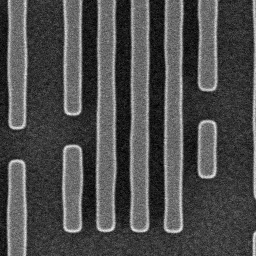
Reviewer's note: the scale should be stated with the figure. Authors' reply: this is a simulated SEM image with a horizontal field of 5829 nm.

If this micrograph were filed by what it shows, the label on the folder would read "groups of lines, slits or small figures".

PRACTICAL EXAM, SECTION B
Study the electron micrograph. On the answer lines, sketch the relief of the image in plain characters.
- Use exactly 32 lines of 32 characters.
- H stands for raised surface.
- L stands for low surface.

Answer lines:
LHHLLLLLHHLLHHLLHHHLLHHLLHHLLLLL
LHHLLLLLHHLLHHLLHHHLLHHLLHHLLLLL
LHHLLLLLHHLLHHLLHHHLLHHLLHHLLLLL
LHHLLLLLHHLLHHLLHHHLLHHLLHHLLLLL
LHHLLLLLHHLLHHLLLHHLLHHLLHHLLLLL
LHHLLLLLHHLLHHLLLHHLLHHLLHHLLLLL
LHHLLLLLHHLLHHLLLHHLLHHLLHHLLLLL
LHHLLLLLHHLLHHLLLHHLLHHLLHHLLLLL
LHHLLLLLHHLLHHLLHHHLLHHLLHHLLLLL
LHHLLLLLHHLLHHLLHHHLLHHLLHHLLLLL
LHHLLLLLHHLLHHLLHHHLLHHLLHHLLLLL
LHHLLLLLHHLLHHLLHHHLLHHLLLLLLLLL
LHHLLLLLHHLLHHLLLHHLLHHLLLLLLLLL
LHHLLLLLHHLLHHLLLHHLLHHLLLLLLLLL
LHHLLLLLLLLLHHLLLHHLLHHLLLLLLLLL
LHHLLLLLLLLLHHLLHHLLLHHLLHHLLLLL
LLLLLLLLLLLLHHLLHHHLLHHLLHHLLLLL
LLLLLLLLLLLLHHLLHHHLLHHLLHHLLLLL
LLLLLLLLHHLLHHLLHHHLLHHLLHHLLLLL
LLLLLLLLHHLLHHLLHHLLLHHLLHHLLLLL
LHHLLLLLHHLLHHLLHHLLLHHLLHHLLLLL
LHHLLLLLHHLLHHLLHHLLLHHLLHHLLLLL
LHHLLLLLHHLLHHLLHHHLLHHLLLLLLLLL
LHHLLLLLHHLLHHLLHHLLLHHLLLLLLLLL
LHHLLLLLHHLLHHLLHHLLLHHLLLLLLLLL
LHHLLLLLHHLLHHLLHHHLLHHLLLLLLLLL
LHHLLLLLHHLLHHLLHHHLLHHLLLLLLLLL
LHHLLLLLHHLLHHLLHHHLLHHLLLLLLLLL
LHHLLLLLHHLLHHLLLHLLLHHLLLLLLLLL
LHHLLLLLLLLLLLLLLLLLLLLLLLLLLLLL
LHHLLLLLLLLLLLLLLLLLLLLLLLLLLLLL
LHHLLLLLLLLLLLLLLLLLLLLLLLLLLLLL